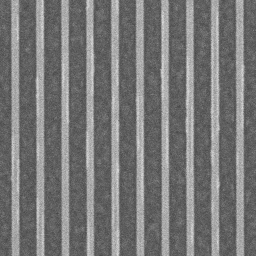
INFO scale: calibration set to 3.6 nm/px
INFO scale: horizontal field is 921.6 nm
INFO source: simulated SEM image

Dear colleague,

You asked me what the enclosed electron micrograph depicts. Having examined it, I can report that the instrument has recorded parallel lines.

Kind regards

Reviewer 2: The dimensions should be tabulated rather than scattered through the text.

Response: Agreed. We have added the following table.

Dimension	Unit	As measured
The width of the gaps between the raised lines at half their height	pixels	17.5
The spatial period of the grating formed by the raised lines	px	24.9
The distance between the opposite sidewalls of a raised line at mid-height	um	0.0265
